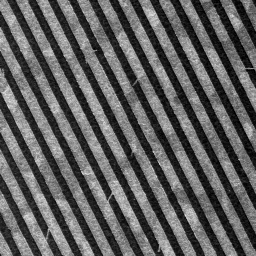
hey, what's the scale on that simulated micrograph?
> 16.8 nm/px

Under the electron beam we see parallel lines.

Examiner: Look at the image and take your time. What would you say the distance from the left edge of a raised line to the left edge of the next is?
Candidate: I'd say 306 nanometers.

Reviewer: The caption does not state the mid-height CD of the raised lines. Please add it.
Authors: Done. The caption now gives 162 nanometers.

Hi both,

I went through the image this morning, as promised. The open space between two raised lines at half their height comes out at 8.38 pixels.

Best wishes